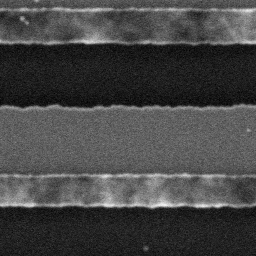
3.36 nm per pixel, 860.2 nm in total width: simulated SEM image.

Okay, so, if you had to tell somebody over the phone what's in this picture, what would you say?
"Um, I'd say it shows lines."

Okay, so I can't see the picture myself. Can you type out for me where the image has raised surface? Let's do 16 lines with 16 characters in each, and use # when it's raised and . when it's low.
################
################
################
................
................
................
................
################
################
################
################
################
################
................
................
................